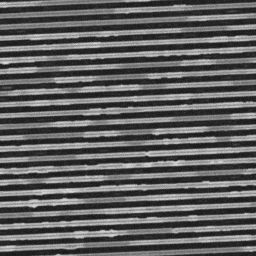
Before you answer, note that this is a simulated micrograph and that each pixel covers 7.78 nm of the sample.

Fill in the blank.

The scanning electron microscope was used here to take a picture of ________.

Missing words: parallel lines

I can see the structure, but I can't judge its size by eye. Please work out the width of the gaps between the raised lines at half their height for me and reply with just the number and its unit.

6.62 pixels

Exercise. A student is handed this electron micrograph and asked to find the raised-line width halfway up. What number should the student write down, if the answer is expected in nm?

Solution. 36.9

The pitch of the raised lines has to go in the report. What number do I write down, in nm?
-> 86.2